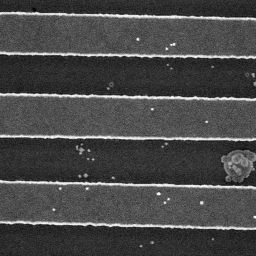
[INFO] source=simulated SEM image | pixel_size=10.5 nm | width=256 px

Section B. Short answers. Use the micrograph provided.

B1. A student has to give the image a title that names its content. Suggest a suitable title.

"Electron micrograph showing lines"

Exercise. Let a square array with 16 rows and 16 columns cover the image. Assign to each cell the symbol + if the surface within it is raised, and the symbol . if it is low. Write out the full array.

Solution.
................
++++++++++++++++
++++++++++++++++
.....+..++++++++
................
................
++++++++++++++++
++++++++++++++++
++++++++++++++++
................
................
++++++++........
++++++++++++++++
++++++++++++++++
................
................